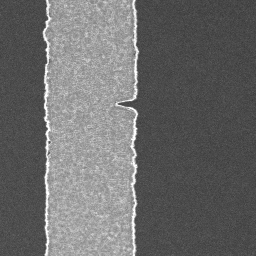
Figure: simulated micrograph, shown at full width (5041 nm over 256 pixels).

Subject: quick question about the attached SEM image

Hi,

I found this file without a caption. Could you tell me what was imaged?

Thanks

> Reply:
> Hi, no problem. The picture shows one or a few lines or trenches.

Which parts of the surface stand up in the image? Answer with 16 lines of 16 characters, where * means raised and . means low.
***.....********
***.....********
***.....********
***......*******
***.....********
***.....********
***.....********
***.....********
***.....********
***.....********
***.....********
***.....********
***.....********
***.....********
***.....********
***.....********